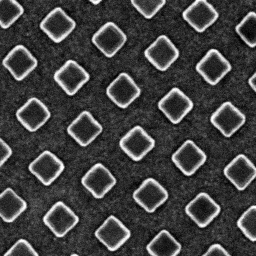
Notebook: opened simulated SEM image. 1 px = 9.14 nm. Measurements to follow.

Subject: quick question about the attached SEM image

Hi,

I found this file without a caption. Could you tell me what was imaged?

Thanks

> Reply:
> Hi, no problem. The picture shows a regular array of raised bodies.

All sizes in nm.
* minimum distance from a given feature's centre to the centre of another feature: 488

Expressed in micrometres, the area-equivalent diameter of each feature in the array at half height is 0.269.